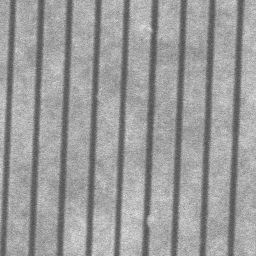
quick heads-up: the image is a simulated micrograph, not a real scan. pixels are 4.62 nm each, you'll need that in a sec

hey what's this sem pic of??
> parallel lines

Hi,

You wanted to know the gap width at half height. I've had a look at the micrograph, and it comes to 0.0387 µm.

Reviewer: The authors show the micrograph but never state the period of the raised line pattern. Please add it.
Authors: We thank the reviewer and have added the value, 132 nm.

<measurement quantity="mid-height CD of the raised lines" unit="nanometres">93.6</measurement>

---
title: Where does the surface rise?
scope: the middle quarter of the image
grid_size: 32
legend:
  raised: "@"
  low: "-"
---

--@@@@@--@@@@@--@@@@@--@@@@@--@@
--@@@@@--@@@@@--@@@@@--@@@@@--@@
--@@@@@--@@@@@--@@@@@--@@@@@--@@
--@@@@@--@@@@@--@@@@@--@@@@@--@@
--@@@@@--@@@@@--@@@@@--@@@@@--@@
--@@@@@--@@@@@--@@@@@--@@@@@--@@
--@@@@@--@@@@@--@@@@@--@@@@@--@@
--@@@@@--@@@@@--@@@@@--@@@@@--@@
--@@@@@--@@@@@--@@@@@--@@@@@--@@
--@@@@@--@@@@@--@@@@@--@@@@@--@@
--@@@@---@@@@@--@@@@@--@@@@@--@@
--@@@@---@@@@@--@@@@@--@@@@@--@@
--@@@@---@@@@@--@@@@@--@@@@@--@@
--@@@@--@@@@@@--@@@@@--@@@@@--@@
-@@@@@--@@@@@@--@@@@---@@@@@--@@
-@@@@@--@@@@@---@@@@---@@@@@--@@
-@@@@@--@@@@@---@@@@---@@@@@--@@
-@@@@@--@@@@@---@@@@---@@@@@--@@
-@@@@@--@@@@@--@@@@@--@@@@@@--@@
-@@@@@--@@@@@--@@@@@--@@@@@---@@
-@@@@@--@@@@@--@@@@@---@@@@---@@
-@@@@@--@@@@@--@@@@@--@@@@@---@@
-@@@@@--@@@@@--@@@@@---@@@@--@@@
-@@@@@--@@@@@--@@@@@--@@@@@--@@@
-@@@@@--@@@@@--@@@@@--@@@@@--@@@
-@@@@@--@@@@@--@@@@@--@@@@@--@@@
-@@@@@--@@@@@--@@@@@--@@@@@--@@@
-@@@@@--@@@@@--@@@@@--@@@@@--@@@
-@@@@@--@@@@@--@@@@@--@@@@@--@@@
-@@@@@--@@@@@--@@@@@--@@@@@--@@@
-@@@@@--@@@@@--@@@@@--@@@@@--@@@
-@@@@@--@@@@@--@@@@@--@@@@@--@@@